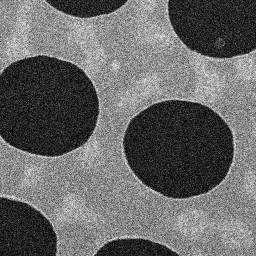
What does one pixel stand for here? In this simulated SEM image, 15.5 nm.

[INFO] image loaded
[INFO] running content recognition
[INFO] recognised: holes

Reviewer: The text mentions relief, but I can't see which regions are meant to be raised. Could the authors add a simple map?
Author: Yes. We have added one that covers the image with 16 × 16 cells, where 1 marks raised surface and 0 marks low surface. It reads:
1110000111100000
1111111111100000
1111111111100000
1101111111111001
0000011111111111
0000001111111111
0000001111000111
0000001100000011
0000001100000001
1100111100000001
1111111100000011
1111111110000011
0111111111111111
0001111111111111
0001111111111111
0000110000011111